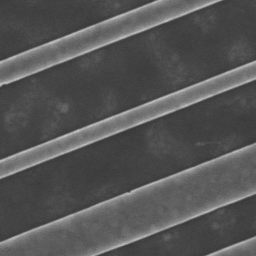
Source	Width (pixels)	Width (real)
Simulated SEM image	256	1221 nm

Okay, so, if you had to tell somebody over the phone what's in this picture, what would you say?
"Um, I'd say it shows one or a few lines or trenches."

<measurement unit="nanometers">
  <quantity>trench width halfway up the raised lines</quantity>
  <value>286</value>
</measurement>